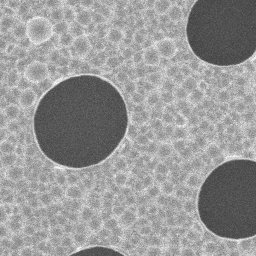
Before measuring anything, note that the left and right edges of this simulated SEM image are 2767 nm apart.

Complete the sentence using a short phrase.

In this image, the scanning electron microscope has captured holes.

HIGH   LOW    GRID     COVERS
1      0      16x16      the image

1111111111110000
1111111111110000
1111111111110000
1111111111110000
1111111111111111
1110000111111111
1100000011111111
1100000011111111
1100000011111111
1110000111111111
1111111111111100
1111111111111000
1111111111110000
1111111111110000
1111111111111000
1111100111111111